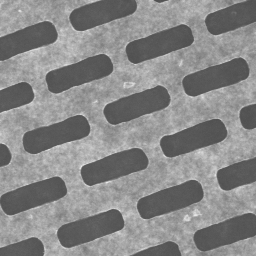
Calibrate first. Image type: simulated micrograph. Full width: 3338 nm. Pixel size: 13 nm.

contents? a regular array of holes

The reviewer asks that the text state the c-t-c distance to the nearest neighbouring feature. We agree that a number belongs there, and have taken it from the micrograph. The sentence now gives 850 nm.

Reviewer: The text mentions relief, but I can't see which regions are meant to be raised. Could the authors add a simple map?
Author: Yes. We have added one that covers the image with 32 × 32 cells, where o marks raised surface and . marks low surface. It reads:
ooooooooooo......oooooooooooo...
ooooooooo........oooooooooo.....
ooooooooo.....oooooooooooo......
ooo....oo...ooooooooo...oo....oo
.......oooooooooooo.....oooooooo
......oooooooooo........oooooooo
...ooooooooooooo......oooooooooo
.ooooooooo....oo...oooooooooo..o
oooooooo......oooooooooooo.....o
oooooo.......oooooooooo........o
oo..oo.....oooooooooooo......ooo
....oo..oooooooooo...oo...oooooo
....ooooooooooo......ooooooooooo
..ooooooooooo........ooooooooo..
ooooooooo.ooo.....oooooooooooo..
ooooooo....ooo.oooooooooo...oo..
ooo........ooooooooooo......oooo
ooo.......oooooooooo........oooo
.oo...oooooooooooooo.....ooooooo
.oooooooooooo.....ooo.oooooooooo
.oooooooooo........oooooooooo...
oooooooooo.......oooooooooo.....
ooooo...oo....ooooooooooooo.....
oo......ooooooooooooo....ooo.ooo
........oooooooooo.......ooooooo
......ooooooooooo.......oooooooo
o..oooooooooo..oo....ooooooooooo
oooooooooo.....ooooooooooooo....
ooooooo........ooooooooooo......
ooooooo......ooooooooooo........
o....ooo..oooooooooo..oo.....ooo
......ooooooooooo......ooooooooo